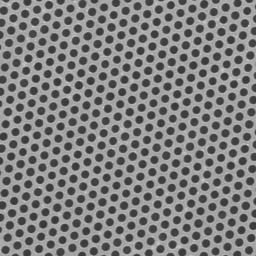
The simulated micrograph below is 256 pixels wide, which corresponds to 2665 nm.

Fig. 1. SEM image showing a regular array of holes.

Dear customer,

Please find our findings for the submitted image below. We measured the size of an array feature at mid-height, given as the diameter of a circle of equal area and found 87.1 nm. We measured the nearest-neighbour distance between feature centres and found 12.3 px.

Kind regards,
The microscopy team